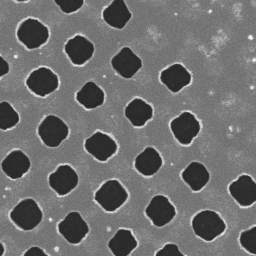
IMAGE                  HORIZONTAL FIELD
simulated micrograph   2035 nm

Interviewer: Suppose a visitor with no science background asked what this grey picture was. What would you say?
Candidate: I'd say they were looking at a regular array of holes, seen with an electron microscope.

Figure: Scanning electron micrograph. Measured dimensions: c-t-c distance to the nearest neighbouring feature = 391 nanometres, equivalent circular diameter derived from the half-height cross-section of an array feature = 223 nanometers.